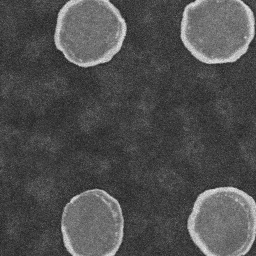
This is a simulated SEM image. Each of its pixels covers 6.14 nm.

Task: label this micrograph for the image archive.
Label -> raised bodies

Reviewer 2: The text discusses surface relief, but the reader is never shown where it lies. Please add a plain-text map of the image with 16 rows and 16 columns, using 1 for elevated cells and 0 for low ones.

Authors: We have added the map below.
0000111000001110
0000111100001111
0000111100001111
0000111000000110
0000000000000000
0000000000000000
0000000000000000
0000000000000000
0000000000000000
0000000000000000
0000000000000000
0000000000000000
0000011000000111
0000111100001111
0000111100001111
0000111000000110